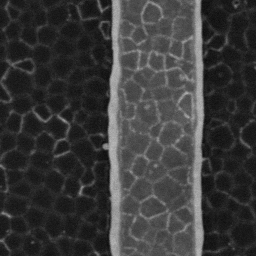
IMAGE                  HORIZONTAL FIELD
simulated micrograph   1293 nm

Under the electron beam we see one or a few lines or trenches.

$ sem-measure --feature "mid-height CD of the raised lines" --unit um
0.425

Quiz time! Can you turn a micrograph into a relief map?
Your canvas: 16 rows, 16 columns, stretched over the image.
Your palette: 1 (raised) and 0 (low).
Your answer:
0000000111110000
0000000111110000
0000000111110000
0000000111110000
0000000111110000
0000000111110000
0000000111110000
0000000111111000
0000000111110000
0000000111110000
0000000111110000
0000000111110000
0000000111110000
0000000111110000
0000000111110000
0000000111110000